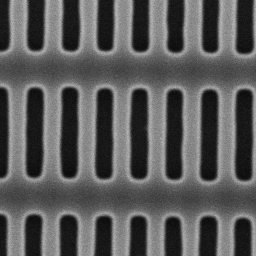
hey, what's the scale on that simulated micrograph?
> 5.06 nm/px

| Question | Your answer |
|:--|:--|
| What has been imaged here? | groups of lines, slits or small figures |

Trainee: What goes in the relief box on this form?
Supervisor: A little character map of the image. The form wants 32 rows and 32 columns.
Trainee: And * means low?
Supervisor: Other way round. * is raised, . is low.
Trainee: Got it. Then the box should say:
.**...**..**..**...**..**...*...
.**...**..**..**...**..**...*...
.**...**..**..**...**..**..**...
.**...**..**..**...**..**..**...
.**...**..**..**...**..**..**...
.**...**..**..**...**..**..**...
****.************.***..***.***.*
********************************
********************************
********************************
********************************
.**..***..**..**..***..**..***..
.**...**..**..**...**..**..**...
.**...**..**..**...**..**..**...
.**...**..**..**...**..**..**...
.**...**..**..**...**..**..**...
.**...**..**..**...**..**..**...
.**...*...**..**...**..**..**...
.**...*...**..**...**..**..**...
.**...*...**..**...**..**..**...
.**..***..**..**...**..**..**...
.**..***..**..**...**..**..**...
*****************.***.***..***.*
********************************
********************************
********************************
********************************
.**..**...**..**..***..**..**..*
.**..**...**..**...*...**..**...
.**..**...**..**...*...**..**...
.**..**...**..**...*...**..**...
.**..**...**..**...*...**..**...